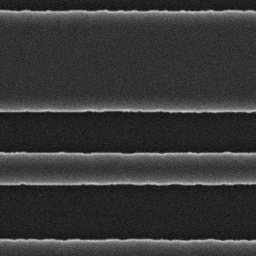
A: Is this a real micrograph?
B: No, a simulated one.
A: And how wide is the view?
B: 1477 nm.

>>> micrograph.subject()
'lines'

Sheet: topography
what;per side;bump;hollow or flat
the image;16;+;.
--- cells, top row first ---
................
++++++++++++++++
++++++++++++++++
++++++++++++++++
++++++++++++++++
++++++++++++++++
++++++++++++++++
................
................
................
++++++++++++++++
++++++++++++++++
................
................
................
++++++++++++++++